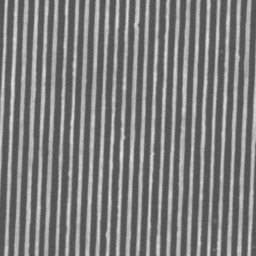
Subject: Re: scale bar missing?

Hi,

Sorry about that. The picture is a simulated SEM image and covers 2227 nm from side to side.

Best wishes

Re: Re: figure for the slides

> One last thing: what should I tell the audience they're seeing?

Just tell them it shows parallel lines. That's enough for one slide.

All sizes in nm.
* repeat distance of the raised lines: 87.9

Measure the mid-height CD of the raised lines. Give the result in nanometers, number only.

22.8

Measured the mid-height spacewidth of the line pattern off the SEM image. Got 6.87 pixels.